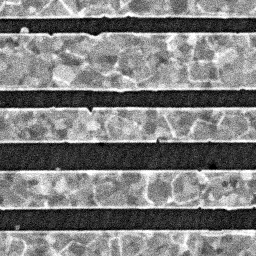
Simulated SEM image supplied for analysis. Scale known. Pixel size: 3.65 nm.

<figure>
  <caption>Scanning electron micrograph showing one or a few lines or trenches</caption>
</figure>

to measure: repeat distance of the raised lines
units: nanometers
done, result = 234